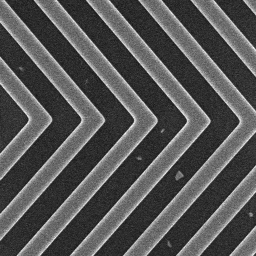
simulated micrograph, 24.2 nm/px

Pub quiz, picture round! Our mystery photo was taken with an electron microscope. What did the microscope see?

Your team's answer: groups of lines, slits or small figures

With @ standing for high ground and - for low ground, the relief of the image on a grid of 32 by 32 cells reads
@----@@----@@@----@@@---@@@----@
@@---@@@----@@@----@@----@@@----
@@@---@@@----@@@---@@@----@@@---
-@@----@@@----@@@---@@@----@@@--
--@@----@@@----@@----@@@----@@@-
--@@@----@@@---@@@----@@@---@@@-
---@@@----@@@---@@@----@@@---@@@
----@@@----@@----@@@----@@@---@@
@----@@@---@@@----@@@----@@----@
@@----@@@---@@@----@@@---@@@----
@@@----@@----@@@----@@@---@@@---
-@@@---@@@----@@@----@@----@@@--
--@@@---@@@----@@@---@@@----@@@-
---@@----@@@----@@@---@@@----@@@
---@@@----@@@----@@----@@@----@@
---@@@----@@@----@@----@@@----@@
--@@@----@@@----@@@---@@@----@@@
--@@----@@@----@@@---@@@----@@@-
-@@@---@@@----@@@----@@@---@@@--
@@@---@@@----@@@----@@@---@@@---
@@----@@----@@@----@@@---@@@----
@----@@@---@@@----@@@----@@@---@
----@@@---@@@----@@@----@@@---@@
---@@@----@@----@@@----@@@----@@
--@@@----@@@---@@@----@@@----@@@
-@@@----@@@---@@@----@@@----@@@-
@@@----@@@----@@----@@@----@@@--
@@----@@@----@@@---@@@----@@@---
@----@@@----@@@---@@@----@@@----
@---@@@----@@@----@@----@@@----@
---@@@----@@@----@@@---@@@----@@
---@@----@@@----@@@---@@@----@@@